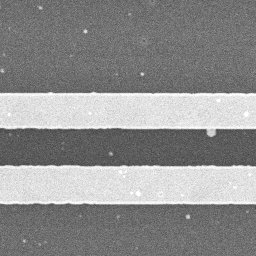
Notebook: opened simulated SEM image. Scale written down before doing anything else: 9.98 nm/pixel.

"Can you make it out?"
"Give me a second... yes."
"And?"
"lines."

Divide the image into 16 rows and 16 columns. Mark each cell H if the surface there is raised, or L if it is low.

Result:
LLLLLLLLLLLLLLLL
LLLLLLLLLLLLLLLL
LLLLLLLLLLLLLLLL
LLLLLLLLLLLLLLLL
LLLLLLLLLLLLLLLL
LLLLLLLLLLLLLLLL
HHHHHHHHHHHHHHHH
HHHHHHHHHHHHHHHH
LLLLLLLLLLLLLLLL
LLLLLLLLLLLLLLLL
HHHHHHHHHHHHHHHH
HHHHHHHHHHHHHHHH
HHHHHHHHHHHHHHHH
LLLLLLLLLLLLLLLL
LLLLLLLLLLLLLLLL
LLLLLLLLLLLLLLLL